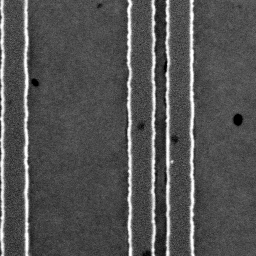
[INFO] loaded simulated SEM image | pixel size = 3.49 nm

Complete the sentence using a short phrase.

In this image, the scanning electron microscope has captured lines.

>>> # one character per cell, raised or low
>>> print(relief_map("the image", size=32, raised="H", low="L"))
HHHLLLLLLLLLLLLLHHHLLHHHLLLLLLLL
HHHLLLLLLLLLLLLLHHHLLHHHLLLLLLLL
HHHLLLLLLLLLLLLLHHHLLHHHLLLLLLLL
HHHLLLLLLLLLLLLLHHHLLHHHLLLLLLLL
HHHLLLLLLLLLLLLLHHHLLHHHLLLLLLLL
HHHLLLLLLLLLLLLLHHHLLHHHLLLLLLLL
HHHLLLLLLLLLLLLLHHHLLHHHLLLLLLLL
HHHLLLLLLLLLLLLLHHHLLHHHLLLLLLLL
HHHLLLLLLLLLLLLLHHHLLHHHLLLLLLLL
HHHLLLLLLLLLLLLLHHHLLHHHLLLLLLLL
HHHLLLLLLLLLLLLLHHHLLHHHLLLLLLLL
HHHLLLLLLLLLLLLLHHHLLHHHLLLLLLLL
HHHLLLLLLLLLLLLLHHHLLHHHLLLLLLLL
HHHLLLLLLLLLLLLLHHHLLHHHLLLLLLLL
HHHLLLLLLLLLLLLLHHHLLHHHLLLLLLLL
HHHLLLLLLLLLLLLLHHHLLHHHLLLLLLLL
HHHLLLLLLLLLLLLLHHHLLHHHLLLLLLLL
HHHLLLLLLLLLLLLLHHHLLHHHLLLLLLLL
HHHLLLLLLLLLLLLLHHHLLHHHLLLLLLLL
HHHLLLLLLLLLLLLLHHHLLHHHLLLLLLLL
HHHLLLLLLLLLLLLLHHHLLHHHLLLLLLLL
HHHLLLLLLLLLLLLLHHHLLHHHLLLLLLLL
HHHLLLLLLLLLLLLLHHHLLHHHLLLLLLLL
HHHLLLLLLLLLLLLLHHHLLHHHLLLLLLLL
HHHLLLLLLLLLLLLLHHHLLHHHLLLLLLLL
HHHLLLLLLLLLLLLLHHHLLHHHLLLLLLLL
HHHLLLLLLLLLLLLLHHHLLHHHLLLLLLLL
HHHLLLLLLLLLLLLLHHHLLHHHLLLLLLLL
HHHLLLLLLLLLLLLLHHHLLHHHLLLLLLLL
HHHLLLLLLLLLLLLLHHHLLHHHLLLLLLLL
HHHLLLLLLLLLLLLLHHHLLHHHLLLLLLLL
HHHLLLLLLLLLLLLLHHHLLHHHLLLLLLLL